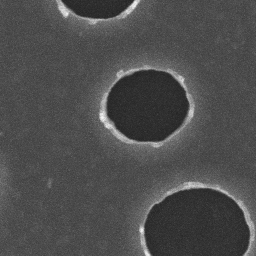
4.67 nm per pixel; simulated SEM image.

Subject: holes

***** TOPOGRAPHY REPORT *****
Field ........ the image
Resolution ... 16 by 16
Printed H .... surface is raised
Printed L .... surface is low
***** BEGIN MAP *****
HHHHLLLLHHHHHHHH
HHHHHHHHHHHHHHHH
HHHHHHHHHHHHHHHH
HHHHHHHHHHHHHHHH
HHHHHHHHLLHHHHHH
HHHHHHHLLLLHHHHH
HHHHHHHLLLLLHHHH
HHHHHHHLLLLLHHHH
HHHHHHHHLLLHHHHH
HHHHHHHHHHHHHHHH
HHHHHHHHHHHHHHHH
HHHHHHHHHHHHHHHH
HHHHHHHHHHLLLLLH
HHHHHHHHHLLLLLLH
HHHHHHHHHLLLLLLL
HHHHHHHHHLLLLLLL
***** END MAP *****